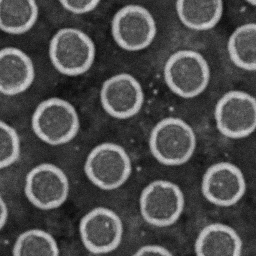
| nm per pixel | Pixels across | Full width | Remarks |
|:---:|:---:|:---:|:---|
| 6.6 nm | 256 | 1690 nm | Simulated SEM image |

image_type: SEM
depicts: a regular array of raised bodies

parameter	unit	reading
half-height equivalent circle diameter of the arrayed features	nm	269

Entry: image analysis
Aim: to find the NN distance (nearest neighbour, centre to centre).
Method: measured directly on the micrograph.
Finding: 428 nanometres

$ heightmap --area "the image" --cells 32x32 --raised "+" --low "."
++++....++++..........+++++.....
++++...........+++.....++++.....
++++...........++++....++++.....
.++...........+++++............+
.......+++.....++++..........+++
.......++++....+++...........+++
++....+++++..................+++
+++....++++..........++++.....++
++++...++++..........+++++......
++++.................+++++......
+++...........+++....++++.......
.+...........++++.....+++.......
.............+++++..........+++.
.....++++....++++..........+++++
....+++++..................+++++
....+++++...........+++....+++++
++...++++..........+++++....+++.
++....++...........+++++........
++..........++.....+++++........
++.........+++++....+++.........
+..........+++++................
....+++....+++++..........++++..
....++++....+++...........++++..
...+++++...........+++....++++..
....++++..........+++++...++++..
.....++...........+++++.........
+...........+.....++++..........
...........++++....+++..........
..........+++++...........++....
...+++....+++++..........++++...
..+++++....+++...........+++++..
..+++++...........+++....+++++..